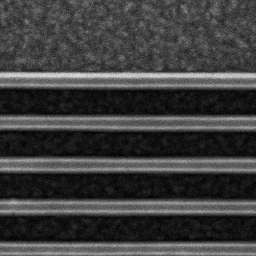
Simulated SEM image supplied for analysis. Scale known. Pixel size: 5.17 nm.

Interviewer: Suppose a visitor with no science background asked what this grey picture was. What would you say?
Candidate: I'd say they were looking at parallel lines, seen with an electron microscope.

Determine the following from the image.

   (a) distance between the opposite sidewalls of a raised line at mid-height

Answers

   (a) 65.9 nm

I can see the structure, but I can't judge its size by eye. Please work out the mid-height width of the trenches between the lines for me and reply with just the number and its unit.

150 nm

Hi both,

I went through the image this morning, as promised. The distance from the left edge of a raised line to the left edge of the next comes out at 218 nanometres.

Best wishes